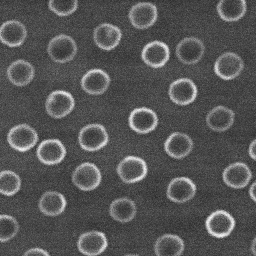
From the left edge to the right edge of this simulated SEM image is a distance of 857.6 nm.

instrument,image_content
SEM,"a regular array of raised bodies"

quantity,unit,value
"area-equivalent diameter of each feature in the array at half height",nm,86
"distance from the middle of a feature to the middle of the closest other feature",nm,141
